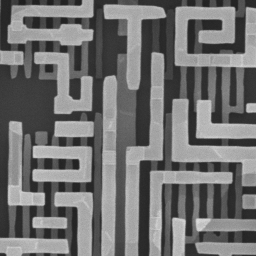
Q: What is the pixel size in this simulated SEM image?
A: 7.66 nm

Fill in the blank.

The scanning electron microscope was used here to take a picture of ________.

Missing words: wiring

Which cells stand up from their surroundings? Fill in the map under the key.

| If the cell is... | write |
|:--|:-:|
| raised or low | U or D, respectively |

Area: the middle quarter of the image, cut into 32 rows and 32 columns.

UDDDDDDDDDDDDDDDUUUDDDUUUDDDDDDU
UDDDDDDDDDDDDDDDUUUDDDUUUDDDDDDD
UDDDDDDDDDDDDDDDUUUDDDUUUDDDDDDD
UDDDUUUDDDUUUDDDUUUDDDUUUDDDDDDD
UDDDUUUDDDUUUDDDUUUDDDUUUDDDDDDD
UDDDUUUDDDUUUDDDUUUDDDUUUDDDDDDD
UDDDUUUDDDUUUDDDDDDDDDUUUDDDDDDD
UDDDUUUDDDUUUDDDDDDDDDUUUDDDDDDD
UUDDUUUDDDUUUDDDDDDDDDUUUDDDDDDD
UUUUUUUDDDUUUDDDDDDDDDUUUDDUUUUD
UUUUUUUDDDUUUDDDDDDDDDUUUDDUUUUD
UUUUUUUDDDUUUDDDDDDDDDUUUDDUUUUD
DDDDDDDDDDUUUDDDDDDDDDUUUDDUUUUD
DDDDDDDDDDUUUDDDDDDDDDUUUDDUUUUD
UUUUUUUDDDUUUDDDDDDDDDUUUDDUUUUD
UUUUUUUDDDUUUDDDDDDDDDUUUDDUUUUD
UUUUUUUDDDUUUDDDDDDDDDUUUDDUUUUD
UUUUUUUDDDUUUDDDDDDDDDUUUDDUUUUD
DDDDDDDDDDUUUDDDDDDDDDUUUDDUUUUD
DDDDDDDDDDUUUDDDDDDDDDUUUDDUUUUD
DDDDDDDDDDUUUDDDDDDDDUUUUDDUUUUU
UUUUUUUDDDUUUDDDUUUUUUUUUDDUUUUU
UUUUUUUDDDUUUDDDUUUUUUUUUDDUUUUU
UUUUUUUDDDUUUDDDUUUUUUUUUDDUUUUU
DDDDUUUDDDUUUDDDUUUDDDDDDDDDDDDD
DDDDUUUDDDUUUDDDUUUDDDDDDDDDDDDD
DDDUUUUDDDUUUDDDUUUDDDDDDDDDDDDD
UUUUUUUDDDUUUDDDUUUDDDUUUUUUUUUU
UUUUUUUDDDUUUDDDUUUDDDUUUUUUUUUU
DDDDDDDDDDUUUDDDUUUDDDUUUUUUUUUU
DDDDDDDDDDUUUDDDUUUDDDUUDDDDDDDD
DDDDDDDDDDUUUDDUUUUDDDUUDDDDDDDD